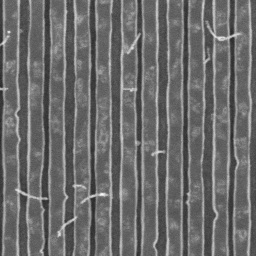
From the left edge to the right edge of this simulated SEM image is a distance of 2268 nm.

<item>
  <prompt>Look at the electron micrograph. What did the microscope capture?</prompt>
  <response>parallel lines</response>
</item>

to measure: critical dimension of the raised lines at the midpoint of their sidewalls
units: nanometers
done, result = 132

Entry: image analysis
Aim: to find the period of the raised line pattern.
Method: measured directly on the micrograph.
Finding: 205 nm